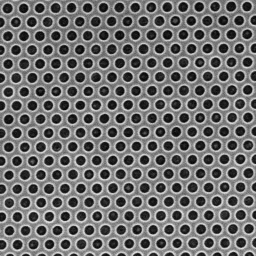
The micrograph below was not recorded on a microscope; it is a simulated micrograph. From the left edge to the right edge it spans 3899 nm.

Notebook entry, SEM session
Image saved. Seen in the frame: a regular array of holes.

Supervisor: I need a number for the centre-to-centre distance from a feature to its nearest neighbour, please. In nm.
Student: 241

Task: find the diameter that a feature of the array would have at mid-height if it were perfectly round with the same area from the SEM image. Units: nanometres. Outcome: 155